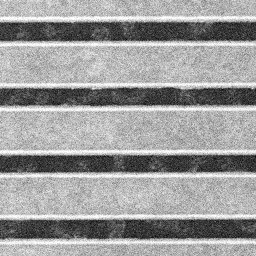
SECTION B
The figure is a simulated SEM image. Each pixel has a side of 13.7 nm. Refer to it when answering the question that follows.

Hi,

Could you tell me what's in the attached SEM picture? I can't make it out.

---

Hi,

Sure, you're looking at one or a few lines or trenches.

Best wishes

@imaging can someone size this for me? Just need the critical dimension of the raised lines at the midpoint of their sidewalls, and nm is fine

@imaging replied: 560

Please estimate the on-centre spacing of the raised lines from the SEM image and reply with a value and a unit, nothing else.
904 nanometers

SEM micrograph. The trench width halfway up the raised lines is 350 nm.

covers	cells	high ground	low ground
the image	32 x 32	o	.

oooooooooooooooooooooooooooooooo
oooooooooooooooooooooooooooooooo
................................
................................
................................
................................
oooooooooooooooooooooooooooooooo
oooooooooooooooooooooooooooooooo
oooooooooooooooooooooooooooooooo
oooooooooooooooooooooooooooooooo
oooooooo..ooooooooo.ooooooooo...
................................
................................
................................
oooooooooooooooooooooooooooooooo
oooooooooooooooooooooooooooooooo
oooooooooooooooooooooooooooooooo
oooooooooooooooooooooooooooooooo
oooooooooooooooooooooooooooooooo
................................
................................
................................
oooooooooooooooooooooooooooooooo
oooooooooooooooooooooooooooooooo
oooooooooooooooooooooooooooooooo
oooooooooooooooooooooooooooooooo
oooooooooooooooooooooooooooooooo
................................
................................
................................
oooooooooooooooooooooooooooooooo
oooooooooooooooooooooooooooooooo